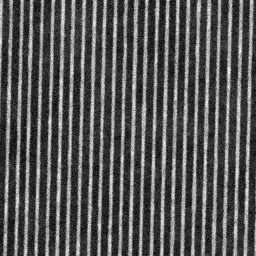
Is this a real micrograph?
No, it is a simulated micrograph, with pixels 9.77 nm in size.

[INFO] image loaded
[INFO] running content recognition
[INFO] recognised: parallel lines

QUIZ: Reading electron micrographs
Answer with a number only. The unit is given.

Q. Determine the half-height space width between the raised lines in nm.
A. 76.9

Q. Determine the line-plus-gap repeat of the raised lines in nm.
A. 102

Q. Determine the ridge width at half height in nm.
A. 22